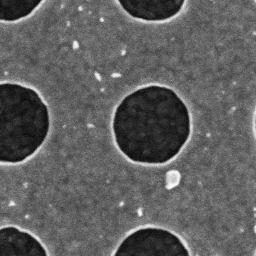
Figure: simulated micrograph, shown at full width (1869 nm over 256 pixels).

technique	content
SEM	holes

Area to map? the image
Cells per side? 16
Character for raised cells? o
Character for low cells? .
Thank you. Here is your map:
..oooooo...ooooo
oooooooooooooooo
oooooooooooooooo
oooooooooooooooo
oooooooooooooooo
..ooooooo.oooooo
...oooo....ooooo
...oooo.....oooo
...oooo.....oooo
..oooooo...ooooo
oooooooooooooooo
oooooooooooooooo
oooooooooooooooo
oooooooooooooooo
..oooooo...ooooo
...oooo.....oooo